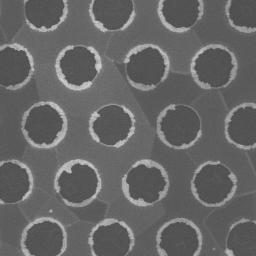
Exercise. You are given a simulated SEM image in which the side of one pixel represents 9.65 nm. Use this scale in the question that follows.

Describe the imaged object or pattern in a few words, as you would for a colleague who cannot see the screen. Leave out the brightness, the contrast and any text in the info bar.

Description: a regular array of holes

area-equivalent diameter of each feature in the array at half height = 0.369 µm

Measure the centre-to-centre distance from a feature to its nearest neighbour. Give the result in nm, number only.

649